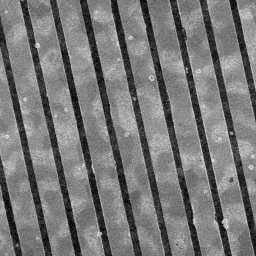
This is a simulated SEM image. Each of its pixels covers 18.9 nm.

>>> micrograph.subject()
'parallel lines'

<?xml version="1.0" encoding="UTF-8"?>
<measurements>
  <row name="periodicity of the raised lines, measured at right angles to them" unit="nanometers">554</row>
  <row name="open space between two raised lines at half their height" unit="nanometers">139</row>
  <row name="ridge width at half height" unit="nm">414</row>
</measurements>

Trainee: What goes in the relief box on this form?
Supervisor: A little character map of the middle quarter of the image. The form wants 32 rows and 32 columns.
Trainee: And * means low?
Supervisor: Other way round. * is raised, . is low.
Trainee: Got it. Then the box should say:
..*****..******..*****..******..
..******..*****..******.******..
..******..*****..******..*****..
...*****..******.******..*****..
*..*****..******..*****..******.
*..*****..******..*****...*****.
*..******..*****..******..*****.
*..******..*****..******..*****.
**..*****..******..*****..******
**..*****..******..****....*****
**..******..*****..****....*****
**..****.*..*****..******..*****
**..******..*****..******..*****
***..*****..******..*****..*****
***..*****..******..*****..*****
***..*****...*****..******..****
***..******..*****..******..****
****..*****..******..*****..****
****..*****..******..*****..****
****..*****..******..*****..****
****..******..*****..******..***
****..******..*****..******..***
*****..*****..******..*****..***
*****..*****..******..*****..***
*****..******..*****..******.***
*****..******..*****..******..**
******.******..******.******..**
******..*****..******..*****..**
******..*****..******..*****..**
.*****..******..*****..******..*
.*****..******..*****..******..*
.******..*****..******..*****..*